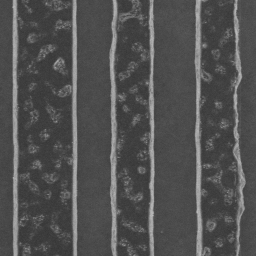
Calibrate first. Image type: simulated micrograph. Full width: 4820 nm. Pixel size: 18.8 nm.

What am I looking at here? one or a few lines or trenches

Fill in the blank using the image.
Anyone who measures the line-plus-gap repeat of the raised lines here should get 1630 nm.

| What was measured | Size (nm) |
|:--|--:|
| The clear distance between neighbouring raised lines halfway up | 794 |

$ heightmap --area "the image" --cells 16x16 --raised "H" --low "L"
LHHHHLLHHLLLHHHL
LHHHHLLHHLLLHHHL
LHHHHLLHHLLLHHHL
LHHHHLLHHLLLHHHL
LHHHHLLHHLLLHHHL
LHHHHLLHHLLLHHHL
LHHHHLLHHHLLHHHL
LHHHHLLHHHLLHHHL
LHHHHLLHHHLLHHHL
LHHHHLLHHHLLHHHL
LHHHHLLHHHLLHHHL
LHHHHLLHHHLLHHHL
LHHHHLLHHHLLHHHL
LHHHHLLHHLLLHHHL
LHHHHLLHHLLLHHHL
LHHHHLLHHHLLHHHL